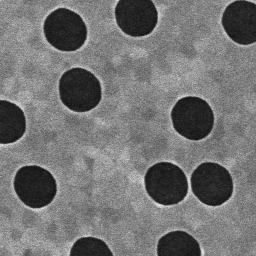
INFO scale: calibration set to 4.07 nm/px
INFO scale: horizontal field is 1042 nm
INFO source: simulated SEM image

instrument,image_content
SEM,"holes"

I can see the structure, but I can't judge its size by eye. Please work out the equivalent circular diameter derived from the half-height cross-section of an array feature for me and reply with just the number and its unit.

176 nm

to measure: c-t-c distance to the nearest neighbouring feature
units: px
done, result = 61.7